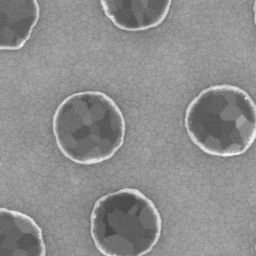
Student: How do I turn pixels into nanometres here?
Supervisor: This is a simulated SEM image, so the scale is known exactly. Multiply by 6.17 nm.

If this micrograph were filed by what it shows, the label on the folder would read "raised bodies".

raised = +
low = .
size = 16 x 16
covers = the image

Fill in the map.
++.....+++......
++.....+++......
++..............
................
................
.............++.
....+++.....++++
...+++++....++++
...+++++....++++
....+++......++.
................
................
......+++.......
++....++++......
++....++++......
+++...+++.......